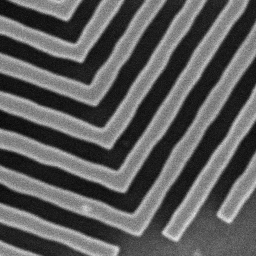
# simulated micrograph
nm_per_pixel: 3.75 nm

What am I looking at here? groups of lines, slits or small figures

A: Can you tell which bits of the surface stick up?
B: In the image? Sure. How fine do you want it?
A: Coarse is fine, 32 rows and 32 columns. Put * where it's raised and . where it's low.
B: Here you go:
..********..***...**...***..***.
.....****...***..***..***...**..
*..........***...**...**...***..
****.......**...**...***..***...
.*****....**...***...**...**...*
...*********...**...**...***..**
......*****...**...***..***...**
**.......*...***...**...**...***
*****........**...***..***..***.
.*******....***..***..***...**..
....******.***...**...**...**...
.......******...**...***..***...
****......***..***...**...**...*
******.........**...**...***..**
..*******.....***..***...**...**
.....******..***...**...**...***
*.......*******...***..***...**.
****......*****..***...**...**..
*******......*...**...**...***..
...******.......**...***..***...
......******...***...**...**...*
**.......********...***..***...*
*****......******...**..***...**
.******.......**...**...**...***
....******........***..***..***.
.......******.....**...**...**..
***......******..**...***..***..
*****.......*******..***....*...
..******.......***...**.........
.....******..........**.........
*.......******..................
****......*****.................